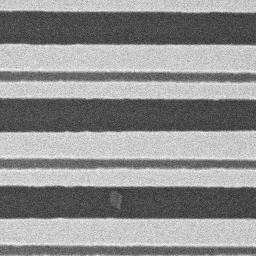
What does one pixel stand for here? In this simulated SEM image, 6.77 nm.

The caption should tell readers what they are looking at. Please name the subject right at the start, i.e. lines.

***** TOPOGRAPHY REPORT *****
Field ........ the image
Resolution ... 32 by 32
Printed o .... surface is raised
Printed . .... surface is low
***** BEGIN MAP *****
oooooooooooooooooooooooooooooooo
................................
................................
................................
................................
................................
oooooooooooooooooooooooooooooooo
oooooooooooooooooooooooooooooooo
oooooooooooooooooooooooooooooooo
oooooooooooooooooooooooooooooooo
oooooooooooooooooooooooooooooooo
oooooooooooooooooooooooooooooooo
................................
................................
................................
................................
.............................ooo
oooooooooooooooooooooooooooooooo
oooooooooooooooooooooooooooooooo
oooooooooooooooooooooooooooooooo
oooooooooooooooooooooooooooooooo
oooooooooooooooooooooooooooooooo
oooooooooooooooooooooooooooooooo
................................
................................
................................
................................
oooooooooooooooooooooooooooooooo
oooooooooooooooooooooooooooooooo
oooooooooooooooooooooooooooooooo
oooooooooooooooooooooooooooooooo
oooooooooooooooooooooooooooooooo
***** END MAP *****